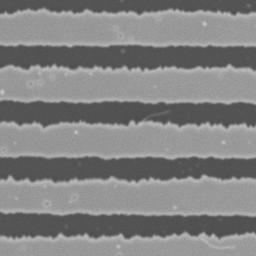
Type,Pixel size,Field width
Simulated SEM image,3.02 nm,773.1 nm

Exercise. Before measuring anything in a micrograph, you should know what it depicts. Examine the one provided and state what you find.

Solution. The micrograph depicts lines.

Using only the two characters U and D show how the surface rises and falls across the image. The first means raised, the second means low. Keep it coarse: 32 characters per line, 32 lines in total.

DDDDDDDDDDDDDDDDDDDDDDDDDDDDDDDD
DDUUUUUDUDUDDDDDUDDUUUUUUUDDDDDD
UUUUUUUUUUUUUUUUUUUUUUUUUUUUUUUU
UUUUUUUUUUUUUUUUUUUUUUUUUUUUUUUU
UUUUUUUUUUUUUUUUUUUUUUUUUUUUUUUU
UUUUUUUUUUUUUUUUUUUUUUUUUUUUUUUU
DDDDDDDDDDDDDDDDDDDDDDDDDDDDDDDD
DDDDDDDDDDDDDDDDDDDDDDDDDDDDDDDD
UUUDUUUUDDUUUUDUDDDDUUDDUUUUUUUD
UUUUUUUUUUUUUUUUUUUUUUUUUUUUUUUU
UUUUUUUUUUUUUUUUUUUUUUUUUUUUUUUU
UUUUUUUUUUUUUUUUUUUUUUUUUUUUUUUU
UUUUUUUUUUUUUUUUUUUUUUUUUUUUUUUU
DDDDDDDDDDDDDDDDDDDDDDDDDDDDDDDD
DDDDDDDDDDDDDDDDDDDDDDDDDDDDDDDD
UUDUUDDUUUUUUDDDUUUUUUDDDUUDDDDD
UUUUUUUUUUUUUUUUUUUUUUUUUUUUUUUU
UUUUUUUUUUUUUUUUUUUUUUUUUUUUUUUU
UUUUUUUUUUUUUUUUUUUUUUUUUUUUUUUU
UUUUUUUUUUUUUUUUUUUUUUUUUUUUUUUU
DDDDDDDDDDDDDDDDDDDDDDDDDDDDDDDD
DDDDDDDDDDDDDDDDDDDDDDDDDDDDDDDD
UUDUDUDDDUUUUUUDDDUUDUUUUUUUUUUU
UUUUUUUUUUUUUUUUUUUUUUUUUUUUUUUU
UUUUUUUUUUUUUUUUUUUUUUUUUUUUUUUU
UUUUUUUUUUUUUUUUUUUUUUUUUUUUUUUU
UUUUUUUUUUUUUUUUUUUUUUUUUUUUUUUU
DDDDDDDDDDDDDDDDDDDDDDDDDDDDDDDD
DDDDDDDDDDDDDDDDDDDDDDDDDDDDDDDD
DDDDDDDUDUUDDDUDDDDUDUUUUUUDDUUU
UUUUUUUUUUUUUUUUUUUUUUUUUUUUUUUU
UUUUUUUUUUUUUUUUUUUUUUUUUUUUUUUU